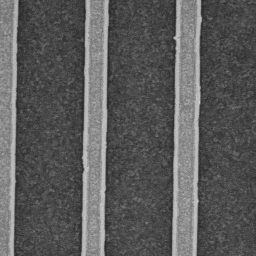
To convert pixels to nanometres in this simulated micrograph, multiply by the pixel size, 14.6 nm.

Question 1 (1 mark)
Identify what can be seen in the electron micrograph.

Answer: one or a few lines or trenches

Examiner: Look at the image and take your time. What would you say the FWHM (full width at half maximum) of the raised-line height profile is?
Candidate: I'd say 0.286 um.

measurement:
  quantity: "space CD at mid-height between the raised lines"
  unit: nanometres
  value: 1050